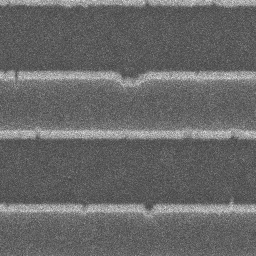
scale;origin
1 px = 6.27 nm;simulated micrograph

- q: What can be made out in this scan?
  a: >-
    one or a few lines or trenches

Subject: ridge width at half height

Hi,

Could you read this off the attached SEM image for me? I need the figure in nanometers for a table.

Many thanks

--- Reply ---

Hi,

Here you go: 374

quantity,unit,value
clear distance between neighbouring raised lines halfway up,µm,0.465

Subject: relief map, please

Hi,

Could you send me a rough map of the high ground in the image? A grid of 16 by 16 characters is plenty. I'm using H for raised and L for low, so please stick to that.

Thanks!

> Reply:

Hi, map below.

LLLLLLLLLLLLLLLL
LLLLLLLLLLLLLLLL
LLLLLLLLLLLLLLLL
LLLLLLLLLLLLLLLL
LLLLLLLLLLLLLLLL
HHHHHHHHHHHHHHHH
HHHHHHHHHHHHHHHH
HHHHHHHHHHHHHHHH
LLLLLLLLLLLLLLLL
LLLLLLLLLLLLLLLL
LLLLLLLLLLLLLLLL
LLLLLLLLLLLLLLLL
LLLLLLLLLLLLLLLL
HHHHHHHHHHHHHHHH
HHHHHHHHHHHHHHHH
HHHHHHHHHHHHHHHH